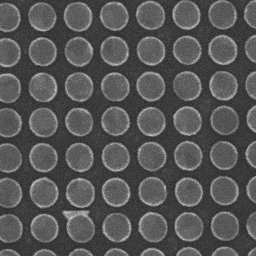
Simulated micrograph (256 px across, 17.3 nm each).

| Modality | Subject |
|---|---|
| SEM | a regular array of raised bodies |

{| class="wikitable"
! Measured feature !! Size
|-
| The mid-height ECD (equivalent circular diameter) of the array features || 488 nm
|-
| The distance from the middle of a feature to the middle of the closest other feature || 605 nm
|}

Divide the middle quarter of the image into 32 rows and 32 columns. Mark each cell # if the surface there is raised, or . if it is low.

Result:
................................
................................
..###......###......###......###
.#####....#####....######...####
#######..#######..#######..#####
#######..#######..#######..#####
#######..#######..#######...####
.######...######...######...####
..####.....####.....####.....###
................................
................................
..###......####.....####.....###
.#####....######...######...####
.######..#######..#######..#####
.######..#######..#######...####
.######...######..#######...####
.######...######...######...####
...###......###.....###.......##
................................
..............................#.
..####.....####....#####....####
.######...######...######...####
.######...######...######...####
.######...######...######...####
.######...######...######...####
.######...######....#####....###
...###......###......##........#
................................
.....................##.........
..####.....####....######....###
.######...######...######...####
.######...######...######...####